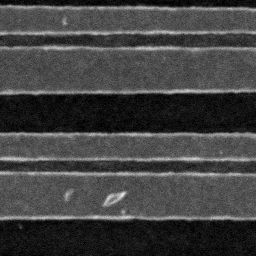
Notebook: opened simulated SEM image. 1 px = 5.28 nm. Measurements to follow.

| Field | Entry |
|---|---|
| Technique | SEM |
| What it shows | lines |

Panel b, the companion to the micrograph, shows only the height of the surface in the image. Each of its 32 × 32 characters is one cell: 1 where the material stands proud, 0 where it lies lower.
00000000000000000000000000000000
11111111111111111111111111111111
11111111111111111111111111111111
11111111111111111111111111111111
11111111111111111111111111111111
11111111111111111111111111111111
11111111111111111111111111111111
11111111111111111111111111111111
11111111111111111111111111111111
11111111111111111111111111111111
11111111111111111111111111111111
11111111111111111110111000000000
00000000000000000000000000000000
00000000000000000000000000000000
00000000000000000000000000000000
00000000000000000000000000000000
00000000000000000000000000000000
11111111111111111111111111111111
11111111111111111111111111111111
11111111111111111111111111111111
11111111111111111111111111111111
11111111111111111111111111111111
11111111111111111111111111111111
11111111111111111111111111111111
11111111111111111111111111111111
11111111111111111111111111111111
11111111111111111111111111111111
00000000000000000000000000000000
00000000000000000000000000000000
00000000000000000000000000000000
00000000000000000000000000000000
00000000000000000000000000000000